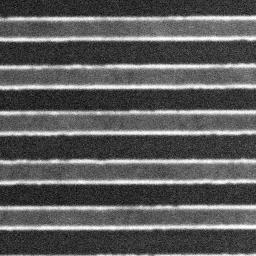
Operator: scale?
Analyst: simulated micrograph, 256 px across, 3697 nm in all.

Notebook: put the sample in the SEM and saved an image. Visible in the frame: lines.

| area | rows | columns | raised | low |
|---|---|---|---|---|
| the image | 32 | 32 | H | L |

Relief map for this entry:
LLLLLLLLLLLLLLLLLLLLLLLLLLLLLLLL
LLLLLLLLLLLLLLLLLLLLLLLLLLLLLLLL
HHHHHHHHHHHHHHHHHHHHHHHHHHHHHHHH
HHHHHHHHHHHHHHHHHHHHHHHHHHHHHHHH
HHHHHHHHHHHHHHHHHHHHHHHHHHHHHHHH
LLLLLLLLLLLLLLLLLLLLLLLLLLLLLLLL
LLLLLLLLLLLLLLLLLLLLLLLLLLLLLLLL
LLLLLLLLLLLLLLLLLLLLLLLLLLLLLLLL
HHHHHHHHHHHHHHHHHHHHHHHHHHHHHHHH
HHHHHHHHHHHHHHHHHHHHHHHHHHHHHHHH
HHHHHHHHHHHHHHHHHHHHHHHHHHHHHHHH
LLLLLLLLLLLLLLLLLLLLLLLLLLLLLLLL
LLLLLLLLLLLLLLLLLLLLLLLLLLLLLLLL
LLLLLLLLLLLLLLLLLLLLLLLLLLLLLLLL
HHHHHHHHHHHHHHHHHHHHHHHHHHHHHHHH
HHHHHHHHHHHHHHHHHHHHHHHHHHHHHHHH
HHHHHHHHHHHHHHHHHHHHHHHHHHHHHHHH
LLLLLLLLLLLLLLLLLLLLLLLLLLLLLLLL
LLLLLLLLLLLLLLLLLLLLLLLLLLLLLLLL
LLLLLLLLLLLLLLLLLLLLLLLLLLLLLLLL
HHHHHHHHHHHHHHHHHHHHHHHHHHHHHHHH
HHHHHHHHHHHHHHHHHHHHHHHHHHHHHHHH
HHHHHHHHHHHHHHHHHHHHHHHHHHHHHHHH
LLLLLLLLLLLLLLLLLLLLLLLLLLLLLLLL
LLLLLLLLLLLLLLLLLLLLLLLLLLLLLLLL
LLLLLLLLLLLLLLLLLLLLLLLLLLLLLLLL
HHHHHHHHHHHHHHHHHHHHHHHHHHHHHHHH
HHHHHHHHHHHHHHHHHHHHHHHHHHHHHHHH
HHHHHHHHHHHHHHHHHHHLLLLLLLLLLLLL
LLLLLLLLLLLLLLLLLLLLLLLLLLLLLLLL
LLLLLLLLLLLLLLLLLLLLLLLLLLLLLLLL
LLLLLLLLLLLLLLLLLLLLLLLLLLLLLLLL